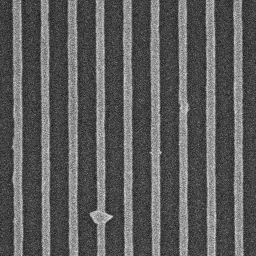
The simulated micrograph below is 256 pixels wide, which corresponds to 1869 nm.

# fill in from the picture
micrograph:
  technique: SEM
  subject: parallel lines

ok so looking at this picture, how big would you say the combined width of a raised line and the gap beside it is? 202 nm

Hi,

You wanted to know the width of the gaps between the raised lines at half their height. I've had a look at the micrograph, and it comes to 146 nm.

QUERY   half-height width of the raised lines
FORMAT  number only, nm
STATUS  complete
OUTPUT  57.5